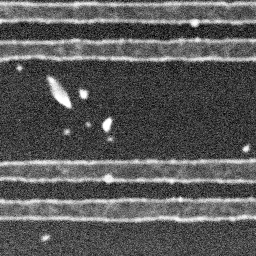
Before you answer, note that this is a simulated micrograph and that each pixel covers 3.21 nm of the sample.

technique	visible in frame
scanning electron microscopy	lines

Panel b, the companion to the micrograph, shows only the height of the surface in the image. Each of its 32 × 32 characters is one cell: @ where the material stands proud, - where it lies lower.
@@@@-----@@@--------@@@@@@@@@@@@
@@@@@@@@@@@@@@@@@@@@@@@@@@@@@@@@
@@@@@@@@@@@@@@@@@@@@@@@@@@@@@@@@
--------------------------------
--------------------------------
@@@@@@@@@@@@@@@@@@@@@@@@@@@@@@@@
@@@@@@@@@@@@@@@@@@@@@@@@@@@@@@@@
--------------------------------
--------------------------------
--------------------------------
------@-------------------------
-------@------------------------
-------@------------------------
--------------------------------
--------------------------------
-------------@------------------
--------------------------------
--------------------------------
--------------------------------
--------------------------------
@@@@@@@@@@@@@@@@@@@@@@@@@@@@@@@@
@@@@@@@@@@@@@@@@@@@@@@@@@@@@@@@@
---@@@@-@@@--@@@@@@@@@@@@@@@@@@@
--------------------------------
--------------------------------
@@@@@@@@@@@@@@@@@@@@@@@@@@@@@@@@
@@@@@@@@@@@@@@@@@@@@@@@@@@@@@@@@
-------------@@@@@----@@--------
--------------------------------
--------------------------------
--------------------------------
--------------------------------